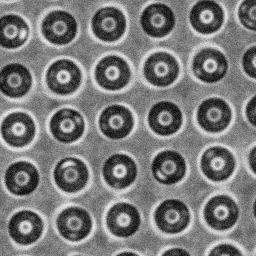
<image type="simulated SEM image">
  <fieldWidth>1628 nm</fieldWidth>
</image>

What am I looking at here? an array of small figures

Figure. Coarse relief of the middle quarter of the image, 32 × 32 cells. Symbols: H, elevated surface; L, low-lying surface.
LLLLHHHLLLLLLLLLLHHLLLLHHLLLLHHL
LLLLLHHLLLLHHLLLLHHLLLLHHHLLLHHL
HLLLLHHLLLLHHLLLLLHLLLLLHLLLLHHH
HLLLLHHLLLLHHLLLLHHLLLLLLLLLLHHH
LLLLLHHHLLLLLLLLLHHHLLLLLLLLHHHH
LLLLLHHHLLLLLLLLHHHHHHLLLLLHHHHH
LLLLHHHHHHLLLLLHHHHHHHHHHHHHHHHH
LLLHHHHHHHHHHHHHHHHHHHHHHHHHHHHH
HHHHHHHHHHHHHHHHHHHHHHHHHHHHHHHH
HHHHHHHHHHHHHHHHHHHHHHHLLLLHHHHH
HHHHHHHHHHHLLLLLHHHHHHLLLLLLHHHH
LLLHHHHHHHLLLLLLLHHHHLLLLLLLLHHH
LLLLHHHHHLLLLLLLLLHHHLLLHHLLLLHH
LLLLLHHHLLLLHHLLLLHHHLLLHHHLLLHH
HHLLLHHHLLLLHHHLLLHHHLLLHHLLLLHH
HHLLLLHHLLLLHHLLLLHHHLLLLLLLLLHH
HHLLLHHHHLLLLLLLLHHHHHLLLLLLLHHH
LLLLLHHHHLLLLLLLHHHHHHLLLLLLHHHH
LLLLHHHHHHHLLLLHHHHHHHHHHHHHHHHH
LLLHHHHHHHHHHHHHHHHHHHHHHHHHHHHH
HHHHHHHHHHHHHHHHHHHHHHHHHHHHHHHH
HHHHHHHHHHHHHHHHHHHHHHHHHLLHHHHH
HHHHHHHHHHHHHLLLHHHHHHHLLLLLLHHH
LLLLHHHHHHHLLLLLLHHHHHLLLLLLLLHH
LLLLLHHHHHLLLLLLLLHHHHLLLLHLLLLH
LLLLLLHHHHLLLLLLLLHHHHLLLHHHLLLH
LHHLLLHHHLLLLHHLLLHHHHLLLHHHLLLH
HHHLLLLHHLLLLHHLLLHHHHLLLLLLLLLH
LHHLLLLHHHLLLLLLLLHHHHHLLLLLLLHH
LLLLLLLHHHLLLLLLLHHHHHHHLLLLLHHH
LLLLLLHHHHLLLLLLLHHHHHHHHHHHHHHH
LLLLLHHHHHHHLLLLHHHHHHHHHHHHHHHH